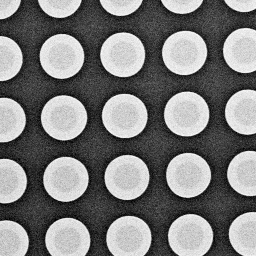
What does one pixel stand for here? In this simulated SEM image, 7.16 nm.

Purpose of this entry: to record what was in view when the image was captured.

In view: an array of small figures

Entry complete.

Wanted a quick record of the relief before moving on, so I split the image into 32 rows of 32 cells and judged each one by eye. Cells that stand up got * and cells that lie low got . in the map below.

**...*****...*****..*****...****
**....***.....***.....**........
................................
................................
.......**.....***....****....***
**....****...*****...*****..****
***..*****...*****..******..****
***..*****...*****..******..****
***..*****...*****...****....***
**....***......*................
................................
..............................**
**....****....***....****....***
***..******..*****...*****..****
***..******..*****...*****..****
***..******..*****...*****...***
***...****....****....***.....**
*...............................
................................
...............**.....***.....**
**....****....****...*****...***
***...*****..******..*****..****
***..******..******..*****...***
***...*****..*****...*****...***
***...****....***......*........
................................
................................
.......***.....***....****...***
***...*****...*****..*****...***
***...*****..******..******..***
****..*****..******..*****...***
***...*****...****....****....**